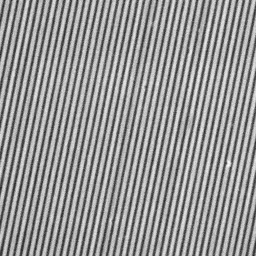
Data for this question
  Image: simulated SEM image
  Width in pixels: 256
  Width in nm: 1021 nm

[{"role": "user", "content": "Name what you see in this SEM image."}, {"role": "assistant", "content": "parallel lines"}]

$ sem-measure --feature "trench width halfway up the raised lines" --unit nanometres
14.2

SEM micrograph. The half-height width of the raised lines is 10.3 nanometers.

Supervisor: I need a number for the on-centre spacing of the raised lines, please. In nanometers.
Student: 26